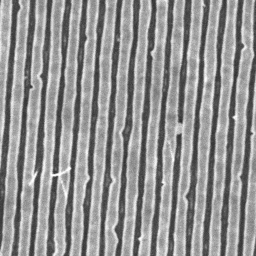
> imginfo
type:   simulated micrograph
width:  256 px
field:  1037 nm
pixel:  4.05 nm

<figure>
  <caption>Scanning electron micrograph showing parallel lines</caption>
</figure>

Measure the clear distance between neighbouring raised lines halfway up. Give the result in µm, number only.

0.0298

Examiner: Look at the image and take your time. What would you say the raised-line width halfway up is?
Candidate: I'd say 40.9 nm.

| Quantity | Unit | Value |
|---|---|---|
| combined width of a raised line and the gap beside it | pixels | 17.3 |